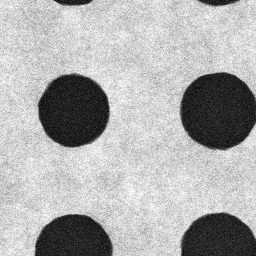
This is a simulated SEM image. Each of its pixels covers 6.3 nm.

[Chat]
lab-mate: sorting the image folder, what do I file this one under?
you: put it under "holes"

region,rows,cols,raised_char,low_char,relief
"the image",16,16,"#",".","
################
################
################
################
################
###...######....
##.....####.....
###....####.....
###...######...#
################
################
################
################
####.########..#
###....#####....
##.....####.....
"